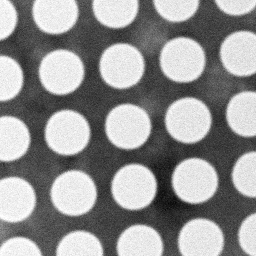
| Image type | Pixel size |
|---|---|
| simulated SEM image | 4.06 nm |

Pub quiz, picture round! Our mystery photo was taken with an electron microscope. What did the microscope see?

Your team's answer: an array of small figures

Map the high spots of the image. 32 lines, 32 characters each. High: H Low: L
HLLLHHHHHLLLHHHHHLLHHHHHHLLHHHHH
HHLLHHHHHHLLHHHHHLLLHHHHLLLLHHHL
HHLLHHHHHLLLHHHHLLLLLHHLLLLLLLLL
HHLLLHHHHLLLLLLLLLLLLLLLLLLLLLLL
HLLLLLLLLLLLLLLLLLLLLLLLLLLLLHHH
LLLLLLLLLLLLLLLLLLLLLHHHHLLLHHHH
LLLLLLLHHLLLLHHHHLLLHHHHHLLLHHHH
HHLLLHHHHHLLLHHHHHLLHHHHHHLLHHHH
HHLLLHHHHHLLLHHHHHLLHHHHHLLLHHHH
HHHLLHHHHHLLLHHHHHLLLHHHHLLLLLLL
HHHLLHHHHHLLLLHHHLLLLLLLLLLLLLLL
HHLLLLLHHLLLLLLLLLLLLLLLLLLLLLLL
LLLLLLLLLLLLLLLLLLLLLLLHHLLLLHHH
LLLLLLLLLLLLLLLHHLLLLHHHHHLLHHHH
LLLLLLLHHHLLLLHHHHLLLHHHHHLLHHHH
HHHLLLHHHHHLLHHHHHHLLHHHHHLLLHHH
HHHLLLHHHHHLLHHHHHHLLHHHHHLLLLHH
HHHHLLHHHHHLLLHHHHLLLLHHHLLLLLLL
HHHLLLLHHHLLLLLHHLLLLLLLLLLLLLLL
HHLLLLLLLLLLLLLLLLLLLLLLLLLLLLHH
LLLLLLLLLLLLLLLLLLLLLLLHHHLLLLHH
LLLLLLLLHHLLLLLHHHHLLLHHHHHLLHHH
HHHLLLLHHHHLLLHHHHHLLLHHHHHLLHHH
HHHHLLLHHHHHLLHHHHHLLLHHHHHLLLHH
HHHHLLLHHHHHLLHHHHHLLLHHHHLLLLLH
HHHHLLLHHHHHLLLHHHLLLLLLLLLLLLLL
HHHHLLLLHHHLLLLLLLLLLLLLLLLLLLLL
LHHLLLLLLLLLLLLLLLLLLLLLHHLLLLLH
LLLLLLLLLLLLLLLLHHHLLLLHHHHLLLHH
LLLLLLLLHHHHLLLHHHHHLLHHHHHHLLHH
LHHHLLLHHHHHLLLHHHHHLLHHHHHHLLHH
HHHHHLLHHHHHHLLHHHHHLLLHHHHLLLLH